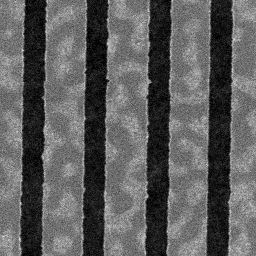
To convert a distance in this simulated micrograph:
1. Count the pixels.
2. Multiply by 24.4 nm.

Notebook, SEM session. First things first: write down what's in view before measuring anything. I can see one or a few lines or trenches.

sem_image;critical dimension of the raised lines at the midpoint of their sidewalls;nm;965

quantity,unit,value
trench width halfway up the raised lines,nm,556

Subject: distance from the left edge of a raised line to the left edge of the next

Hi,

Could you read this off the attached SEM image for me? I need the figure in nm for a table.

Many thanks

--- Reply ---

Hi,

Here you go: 1510